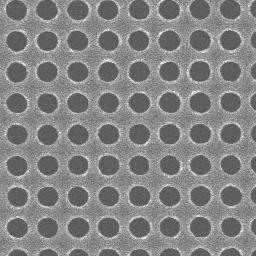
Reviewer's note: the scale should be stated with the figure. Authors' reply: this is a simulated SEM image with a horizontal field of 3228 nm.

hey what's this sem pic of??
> a regular array of holes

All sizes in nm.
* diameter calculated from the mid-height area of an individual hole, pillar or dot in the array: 259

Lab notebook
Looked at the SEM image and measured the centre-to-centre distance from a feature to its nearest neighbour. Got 383 nanometres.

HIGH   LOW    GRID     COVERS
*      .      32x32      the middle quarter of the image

*.....***....****....***....****
*.....***.....**.....***.....**.
*.....**......**.....***.....**.
*.....***....****....***.....***
***.******.*******.*************
********************************
********************************
**..******..*****...*****...****
*.....***....***.....***.....**.
*.....**......**......**.....**.
*.....***.....**.....***.....**.
**....****...****....****....***
***********.********************
********************************
********************************
**...*****...****...*****...****
*.....***.....**.....***.....**.
*.....**......**......**.....**.
*.....***.....**.....***.....***
**...*****...****....****...****
********************************
********************************
********************************
**...****....****...*****...****
*.....***.....**.....***.....***
*.....**......**.....***.....***
*.....***.....***....***.....***
**...*****...*****..*****...****
********************************
********************************
***.**************.*************
**...****....****....***....****